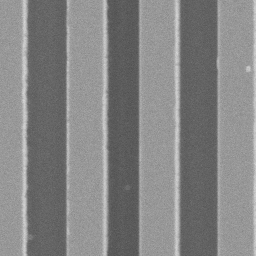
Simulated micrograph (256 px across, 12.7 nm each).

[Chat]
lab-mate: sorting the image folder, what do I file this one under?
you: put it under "lines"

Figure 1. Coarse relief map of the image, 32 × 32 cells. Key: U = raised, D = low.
UUUDDDDDUUUUUDDDDUUUUUDDDDDUUUUU
UUUDDDDDUUUUUDDDDUUUUUDDDDDUUUUU
UUUDDDDDUUUUUDDDDUUUUUDDDDDUUUUU
UUUDDDDDUUUUUDDDDUUUUUDDDDDUUUUU
UUUDDDDDUUUUUDDDDUUUUUDDDDDUUUUU
UUUDDDDDUUUUUDDDDUUUUUDDDDDUUUUU
UUUDDDDDUUUUUDDDDUUUUUDDDDDUUUUU
UUUDDDDDUUUUUDDDDUUUUUDDDDDUUUUU
UUUDDDDDUUUUUDDDDUUUUUDDDDDUUUUU
UUUDDDDDUUUUUDDDDUUUUUDDDDDUUUUU
UUUDDDDDUUUUUDDDDUUUUUDDDDDUUUUU
UUUDDDDDUUUUUDDDDUUUUUDDDDDUUUUU
UUUDDDDDUUUUUDDDDUUUUUDDDDDUUUUU
UUUDDDDDUUUUUDDDDUUUUUDDDDDUUUUU
UUUDDDDDUUUUUDDDDUUUUUDDDDDUUUUU
UUUDDDDDUUUUUDDDDUUUUUDDDDDUUUUU
UUUDDDDDUUUUUDDDDUUUUUDDDDDUUUUU
UUUDDDDDUUUUUDDDDUUUUUDDDDDUUUUU
UUUDDDDDUUUUUDDDDUUUUUDDDDDUUUUU
UUUDDDDDUUUUUDDDDUUUUUDDDDDUUUUU
UUUDDDDDUUUUUDDDDUUUUUDDDDDUUUUU
UUUDDDDDUUUUUDDDDUUUUUDDDDDUUUUU
UUUDDDDDUUUUUDDDDUUUUUDDDDDUUUUU
UUUDDDDDUUUUUDDDDUUUUUDDDDDUUUUU
UUUDDDDDUUUUUDDDDUUUUUDDDDDUUUUU
UUUDDDDDUUUUUDDDDUUUUUDDDDDUUUUU
UUUDDDDDUUUUUDDDDUUUUUDDDDDUUUUU
UUUDDDDDUUUUUDDDDUUUUUDDDDDUUUUU
UUUDDDDDUUUUUDDDDUUUUUDDDDDUUUUU
UUUDDDDDUUUUUDDDDUUUUUDDDDDUUUUU
UUUDDDDDUUUUUDDDDUUUUUDDDDDUUUUU
UUUDDDDDUUUUUDDDDUUUUUDDDDDUUUUU